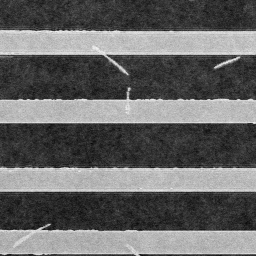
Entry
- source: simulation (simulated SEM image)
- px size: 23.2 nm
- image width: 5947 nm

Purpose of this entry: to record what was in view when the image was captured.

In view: lines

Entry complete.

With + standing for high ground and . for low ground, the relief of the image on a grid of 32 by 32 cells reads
................................
................................
................................
................................
++++++++++++++++++++++++++++++++
++++++++++++++++++++++++++++++++
++++++++++++++++++++++++++++++++
................................
................................
................................
................................
................................
....+.....+....++.+++.+++.+++..+
++++++++++++++++++++++++++++++++
++++++++++++++++++++++++++++++++
................................
................................
................................
................................
................................
................................
++++++++++++++++++++++++++++++++
++++++++++++++++++++++++++++++++
++++++++++++++++++++++++++++++++
................................
................................
................................
................................
................................
++++++++++++++++++++++++++++++++
++++++++++++++++++++++++++++++++
++++++++++++++++++++++++++++++++